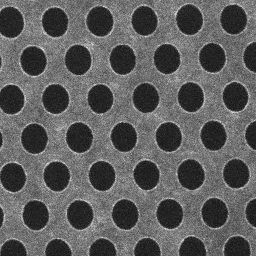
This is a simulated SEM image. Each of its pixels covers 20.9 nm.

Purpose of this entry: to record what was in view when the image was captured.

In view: a regular array of holes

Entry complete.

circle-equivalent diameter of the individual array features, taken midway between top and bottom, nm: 607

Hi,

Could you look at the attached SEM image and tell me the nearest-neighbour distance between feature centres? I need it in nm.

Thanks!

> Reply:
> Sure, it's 923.